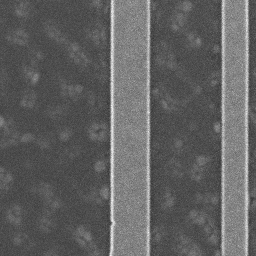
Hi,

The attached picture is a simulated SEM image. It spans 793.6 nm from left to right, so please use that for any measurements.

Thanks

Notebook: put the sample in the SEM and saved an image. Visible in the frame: one or a few lines or trenches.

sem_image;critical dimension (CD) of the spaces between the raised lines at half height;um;0.229